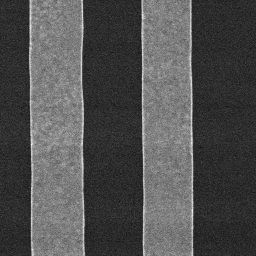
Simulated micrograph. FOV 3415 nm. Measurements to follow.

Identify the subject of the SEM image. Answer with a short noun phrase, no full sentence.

wiring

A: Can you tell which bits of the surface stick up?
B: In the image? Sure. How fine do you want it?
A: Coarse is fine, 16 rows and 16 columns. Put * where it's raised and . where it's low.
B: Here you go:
..***....***....
..***....***....
..***....***....
..***....***....
..***....***....
..***....***....
..***....***....
..***....***....
..***....***....
..***....***....
..***....***....
..***....***....
..***....***....
..***....***....
..***....***....
..***....***....